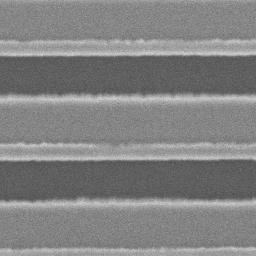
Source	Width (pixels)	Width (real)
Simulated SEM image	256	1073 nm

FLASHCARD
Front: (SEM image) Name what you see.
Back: lines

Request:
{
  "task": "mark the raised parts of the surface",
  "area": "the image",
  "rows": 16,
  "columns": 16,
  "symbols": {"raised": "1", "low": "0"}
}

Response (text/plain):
1111111111111111
1111111111111111
1111111111111111
0000000000000000
0000000000000000
0000000000000000
1111111111111111
1111111111111111
1111111111111111
1111111111111111
0000000000000000
0000000000000000
0000000000000000
1111111111111111
1111111111111111
1111111111111111